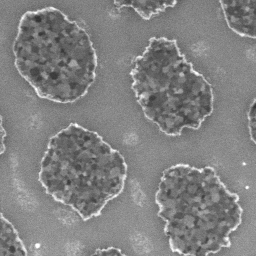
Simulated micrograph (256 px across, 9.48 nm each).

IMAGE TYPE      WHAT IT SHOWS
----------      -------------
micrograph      raised bodies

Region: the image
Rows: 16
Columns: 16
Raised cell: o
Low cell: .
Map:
........oo....oo
.oooo.........oo
.ooooo....o.....
.ooooo...oo.....
.ooooo..oooo....
..oooo..ooooo...
.........oooo...
.........oooo...
...ooo..........
...oooo.........
...ooooo...o....
...ooooo..oooo..
....ooo...ooooo.
.....o....ooooo.
o.........oooo..
o..........ooo..